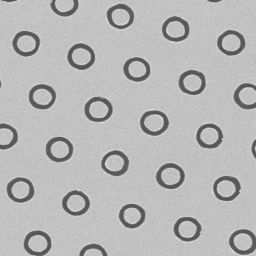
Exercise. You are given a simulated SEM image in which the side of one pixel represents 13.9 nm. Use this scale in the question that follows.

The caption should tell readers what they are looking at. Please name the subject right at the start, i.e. a regular array of ring-shaped grooves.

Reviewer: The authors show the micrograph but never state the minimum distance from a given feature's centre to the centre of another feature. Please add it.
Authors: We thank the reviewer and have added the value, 767 nm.